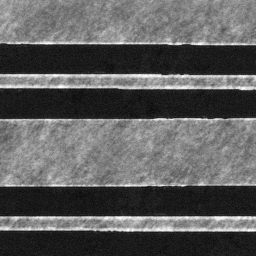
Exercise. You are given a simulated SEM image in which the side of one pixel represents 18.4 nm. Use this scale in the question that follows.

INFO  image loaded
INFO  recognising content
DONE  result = lines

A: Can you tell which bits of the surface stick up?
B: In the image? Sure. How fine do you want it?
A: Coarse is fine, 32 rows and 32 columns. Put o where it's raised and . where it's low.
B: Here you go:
oooooooooooooooooooooooooooooooo
oooooooooooooooooooooooooooooooo
oooooooooooooooooooooooooooooooo
oooooooooooooooooooooooooooooooo
oooooooooooooooooooooooooooooooo
.....................oo.oooooooo
................................
................................
................................
oooooooooooooooooooooooooooooooo
oooooooooooooooooooooooooooooooo
................................
................................
................................
................................
oooooooooooooooooooooooooooooooo
oooooooooooooooooooooooooooooooo
oooooooooooooooooooooooooooooooo
oooooooooooooooooooooooooooooooo
oooooooooooooooooooooooooooooooo
oooooooooooooooooooooooooooooooo
oooooooooooooooooooooooooooooooo
oooooooooooooooooooooooooooooooo
................................
................................
................................
................................
oooooooooooooooooooooooooooooooo
oooooooooooooooooooooooooooooooo
................................
................................
................................